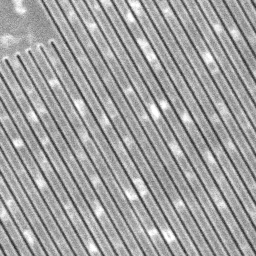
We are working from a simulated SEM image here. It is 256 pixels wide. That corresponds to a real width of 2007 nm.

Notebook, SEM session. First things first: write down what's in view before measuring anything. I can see parallel lines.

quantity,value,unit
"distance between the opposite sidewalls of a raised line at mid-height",69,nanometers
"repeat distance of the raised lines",0.0952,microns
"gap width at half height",27.3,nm